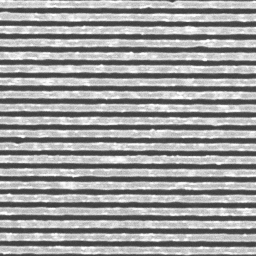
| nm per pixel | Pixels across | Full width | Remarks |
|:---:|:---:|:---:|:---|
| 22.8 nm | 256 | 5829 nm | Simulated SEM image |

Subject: parallel lines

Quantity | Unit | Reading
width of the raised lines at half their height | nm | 176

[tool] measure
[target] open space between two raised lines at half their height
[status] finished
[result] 111 nanometres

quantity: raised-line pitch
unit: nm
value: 295